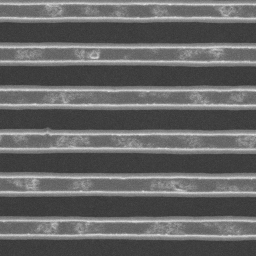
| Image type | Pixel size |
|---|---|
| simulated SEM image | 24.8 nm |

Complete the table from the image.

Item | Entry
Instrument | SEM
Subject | parallel lines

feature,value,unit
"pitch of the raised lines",1080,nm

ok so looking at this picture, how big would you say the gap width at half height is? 0.624 micrometres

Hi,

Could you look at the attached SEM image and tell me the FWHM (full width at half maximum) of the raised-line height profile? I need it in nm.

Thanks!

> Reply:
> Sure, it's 447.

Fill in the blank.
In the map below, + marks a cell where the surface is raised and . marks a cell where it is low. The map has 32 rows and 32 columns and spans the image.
++++++++++++++++++++++++++++++++
++++++++++++++++++++++++++++++++
...+............................
................................
................................
................................
++++++++++++++++++++++++++++++++
++++++++++++++++++++++++++++++++
................................
................................
................................
++++++++++++++++++++++++++++++++
++++++++++++++++++++++++++++++++
................................
................................
................................
...++++.........................
++++++++++++++++++++++++++++++++
++++++++++++++++++++++++++++++++
................................
................................
................................
++++++++++++++++++++++++++++++++
++++++++++++++++++++++++++++++++
................................
................................
................................
+++++++++++++........+++.+++++++
++++++++++++++++++++++++++++++++
++++.+++++++++++++++++++++++++++
................................
................................